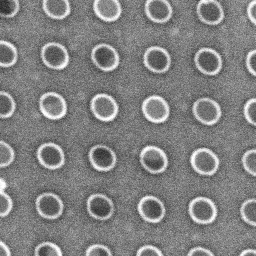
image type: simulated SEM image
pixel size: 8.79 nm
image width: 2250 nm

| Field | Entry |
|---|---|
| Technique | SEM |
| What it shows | a regular array of raised bodies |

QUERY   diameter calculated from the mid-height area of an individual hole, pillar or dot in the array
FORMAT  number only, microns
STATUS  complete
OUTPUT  0.217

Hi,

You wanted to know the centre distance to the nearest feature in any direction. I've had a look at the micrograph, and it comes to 436 nm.